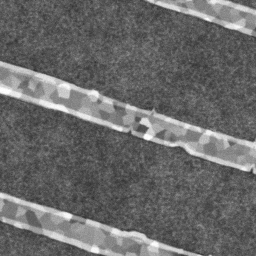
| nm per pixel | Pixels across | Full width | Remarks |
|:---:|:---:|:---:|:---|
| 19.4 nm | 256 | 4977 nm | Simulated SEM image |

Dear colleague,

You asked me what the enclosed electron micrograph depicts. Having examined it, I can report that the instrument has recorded one or a few lines or trenches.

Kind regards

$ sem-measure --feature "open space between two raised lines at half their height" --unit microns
1.94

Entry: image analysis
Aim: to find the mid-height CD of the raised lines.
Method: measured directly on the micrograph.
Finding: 473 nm